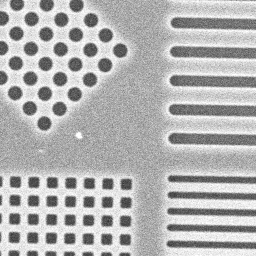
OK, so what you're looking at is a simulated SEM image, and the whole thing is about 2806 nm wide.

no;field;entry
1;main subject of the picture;groups of lines, slits or small figures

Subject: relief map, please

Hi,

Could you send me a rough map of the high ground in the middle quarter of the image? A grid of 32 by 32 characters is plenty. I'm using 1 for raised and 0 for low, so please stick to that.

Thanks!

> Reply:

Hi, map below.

10000111000011111111111111111111
10001111100011111111111111111111
11111000111111111111111111111111
01111000111111111111111111000000
01111000111111111111111111000000
11111000111111111111111111100000
10001111111111111111111111111111
10000111111111111111111111111111
10001111111111111111111111111111
11111111111111111111111111111111
01111111111111111111111111000000
01111111111111111111111111000000
11111111111111111111111111100000
11111111111111111111111111111111
11111111111111111111111111111111
11111111111111111111111111111111
11111111111111111111111111111111
11111111111111111111111111000000
11111111111111111111111111000000
11111111111111111111111111000000
11111111111111111111111111111111
11111111111111111111111111111111
11111111111111111111111111111111
11111111111111111111111111111111
11111111111111111111111111111111
11111111111111111111111111111111
11111111111111111111111111111111
11111111111111111111111111111111
00011000110011101111111111000000
00011000100011000111111111000000
00011000100011000111111111111111
11111111110011101111111111111111